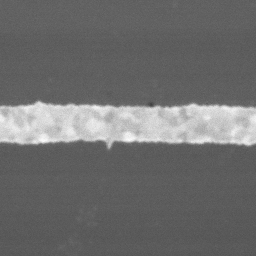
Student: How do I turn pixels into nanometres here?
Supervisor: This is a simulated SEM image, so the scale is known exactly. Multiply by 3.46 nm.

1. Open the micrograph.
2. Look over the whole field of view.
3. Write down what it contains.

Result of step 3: one or a few lines or trenches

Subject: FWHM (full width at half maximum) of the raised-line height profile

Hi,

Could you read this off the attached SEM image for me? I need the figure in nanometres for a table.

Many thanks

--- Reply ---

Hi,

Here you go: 116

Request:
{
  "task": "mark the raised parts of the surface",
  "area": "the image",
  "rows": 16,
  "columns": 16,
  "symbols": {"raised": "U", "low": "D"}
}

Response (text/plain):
DDDDDDDDDDDDDDDD
DDDDDDDDDDDDDDDD
DDDDDDDDDDDDDDDD
DDDDDDDDDDDDDDDD
DDDDDDDDDDDDDDDD
DDDDDDDDDDDDDDDD
DDDDDDDDDDDDDDDD
UUUUUUUUUUUUUUUU
UUUUUUUUUUUUUUUU
DDDDDDDDDDDDDDDD
DDDDDDDDDDDDDDDD
DDDDDDDDDDDDDDDD
DDDDDDDDDDDDDDDD
DDDDDDDDDDDDDDDD
DDDDDDDDDDDDDDDD
DDDDDDDDDDDDDDDD